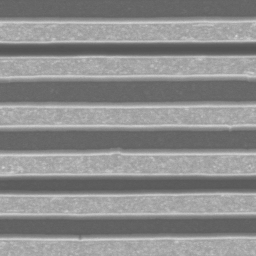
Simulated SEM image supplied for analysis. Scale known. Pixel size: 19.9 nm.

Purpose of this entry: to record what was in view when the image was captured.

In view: parallel lines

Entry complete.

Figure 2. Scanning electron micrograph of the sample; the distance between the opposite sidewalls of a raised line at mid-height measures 484 nm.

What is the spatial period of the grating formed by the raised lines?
859 nanometers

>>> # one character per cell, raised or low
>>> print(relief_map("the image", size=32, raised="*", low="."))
................................
................................
.............................***
********************************
********************************
*********.......................
................................
********************************
********************************
********************************
................................
................................
................................
********************************
********************************
********************************
................................
................................
................................
********************************
********************************
********************************
................................
................................
********************************
********************************
********************************
................................
................................
...........................****.
********************************
********************************